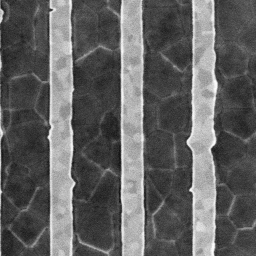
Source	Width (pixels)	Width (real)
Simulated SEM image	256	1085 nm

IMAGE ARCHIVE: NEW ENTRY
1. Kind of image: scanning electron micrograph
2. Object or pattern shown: one or a few lines or trenches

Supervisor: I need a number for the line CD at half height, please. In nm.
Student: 86.9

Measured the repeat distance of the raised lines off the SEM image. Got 0.302 µm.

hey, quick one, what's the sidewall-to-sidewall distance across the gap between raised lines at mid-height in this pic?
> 215 nanometers